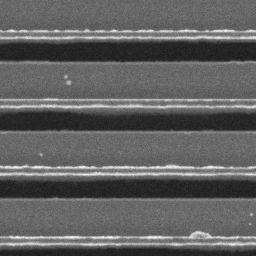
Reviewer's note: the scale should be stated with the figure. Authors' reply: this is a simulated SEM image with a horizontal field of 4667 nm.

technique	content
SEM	lines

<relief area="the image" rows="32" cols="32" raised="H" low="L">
HHHHHHHHHHHHHHHHHHHHHHHHHHHHHHHH
HHHHHHHHHHHHHHHHHHHHHHHHHHHHHHHH
HHHHHHHHHHHHHHHHHHHHHHHHHHHHHHHH
HHHHHHHHHHHHHHHHHHHHHHHHHHHHHHHH
HHHHHHHHHHHHHHHHHHHHHHHHHHHHHHHH
LLLLLLLLLLLLLLLLLLLLLLLLLLLLLLLL
LLLLLLLLLLLLLLLLLLLLLLLLLLLLLLLL
LLLLLLLLLLLLLLLLLLLLLLLLLLLLLLLL
HHHHHHHHHHHHHHHHHHHHHHHHHHHHHHHH
HHHHHHHHHHHHHHHHHHHHHHHHHHHHHHHH
HHHHHHHHHHHHHHHHHHHHHHHHHHHHHHHH
HHHHHHHHHHHHHHHHHHHHHHHHHHHHHHHH
HHHHHHHHHHHHHHHHHHHHHHHHHHHHHHHH
LLLLLLLLLLLLLLLLLLLLLLLLLLLLLLLL
LLLLLLLLLLLLLLLLLLLLLLLLLLLLLLLL
LLLLLLLLLLLLLLLLLLLLLLLLLLLLLLLL
LLLLLLLLHLLLLLLLLLLLLLLLLLLLLLLL
HHHHHHHHHHHHHHHHHHHHHHHHHHHHHHHH
HHHHHHHHHHHHHHHHHHHHHHHHHHHHHHHH
HHHHHHHHHHHHHHHHHHHHHHHHHHHHHHHH
HHHHHHHHHHHHHHHHHHHHHHHHHHHHHHHH
HHHHHHHHHHHHHHHHHHHHHHHHHHHHHHHH
LLLLLLLLLLLLLLLLLLLLLLLLLLLLLLLL
LLLLLLLLLLLLLLLLLLLLLLLLLLLLLLLL
LLLLLLLLLLLLLLLLLLLLLLLLLLLLLLLL
HHHHHHHHHHHHHHHHHHHHHHHHHHHHHHHH
HHHHHHHHHHHHHHHHHHHHHHHHHHHHHHHH
HHHHHHHHHHHHHHHHHHHHHHHHHHHHHHHH
HHHHHHHHHHHHHHHHHHHHHHHHHHHHHHHH
HHHHHHHHHHHHHHHHHHHHHHHHHHHHHHHH
HHHHHHHHHHHHHHHHHHHHHHHHHHHHHHHH
LLLLLLLLLLLLLLLLLLLLLLLLLLLLLLLL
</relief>